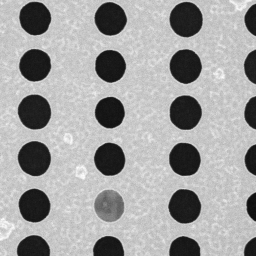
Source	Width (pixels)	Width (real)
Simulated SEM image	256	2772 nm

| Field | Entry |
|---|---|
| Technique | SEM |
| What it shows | a regular array of holes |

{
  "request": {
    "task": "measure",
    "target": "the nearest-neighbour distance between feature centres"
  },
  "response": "0.505 micrometres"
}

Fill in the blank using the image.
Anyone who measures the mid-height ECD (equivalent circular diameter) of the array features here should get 353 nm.